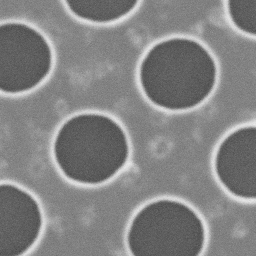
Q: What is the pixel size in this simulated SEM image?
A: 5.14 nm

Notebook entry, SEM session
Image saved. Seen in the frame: holes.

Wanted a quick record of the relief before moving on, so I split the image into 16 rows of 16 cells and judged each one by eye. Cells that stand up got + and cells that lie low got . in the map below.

++++....++++++..
.++++++++++++++.
...+++++++..++++
...++++++....+++
...++++++....+++
..+++++++....+++
++++++++++..++++
++++...+++++++++
++++....++++++..
+++.....++++++..
++++....+++++...
++++++++++++++..
..++++++++++++++
...++++++...++++
..++++++.....+++
..++++++.....+++